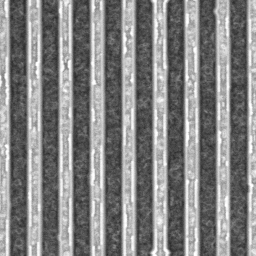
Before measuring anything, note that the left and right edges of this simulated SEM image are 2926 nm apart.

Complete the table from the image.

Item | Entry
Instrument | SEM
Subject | parallel lines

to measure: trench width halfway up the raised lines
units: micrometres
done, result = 0.211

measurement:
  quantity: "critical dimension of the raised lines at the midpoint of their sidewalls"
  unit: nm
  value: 144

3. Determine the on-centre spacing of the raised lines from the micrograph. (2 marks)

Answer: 360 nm